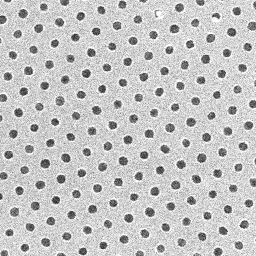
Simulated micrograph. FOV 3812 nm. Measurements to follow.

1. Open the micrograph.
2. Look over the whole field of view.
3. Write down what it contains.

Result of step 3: a regular array of holes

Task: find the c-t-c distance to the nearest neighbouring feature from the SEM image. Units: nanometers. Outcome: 319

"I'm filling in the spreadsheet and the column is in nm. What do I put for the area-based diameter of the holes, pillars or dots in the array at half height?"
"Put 140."